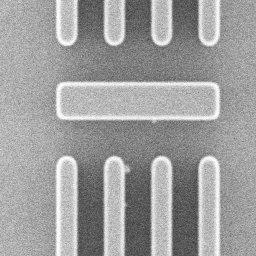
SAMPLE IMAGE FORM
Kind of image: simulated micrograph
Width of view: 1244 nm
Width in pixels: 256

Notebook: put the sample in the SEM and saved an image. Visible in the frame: groups of lines, slits or small figures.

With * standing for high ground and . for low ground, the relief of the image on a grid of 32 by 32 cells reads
.......***...**....**....**.....
.......***...**....**....**.....
.......***...**....**....**.....
.......***...**....**....**.....
.......***...**....**....**.....
........*.....*.....*.....*.....
................................
................................
................................
................................
........*******************.....
.......********************.....
.......********************.....
.......********************.....
.......********************.....
................................
................................
................................
................................
................................
.......**....**....**....**.....
.......***...**....**....**.....
.......***...**....**....**.....
.......***...**....**....**.....
.......***...**....**....**.....
.......***...**....**....**.....
.......***...**....**....**.....
.......***...**....**....**.....
.......***...**....**....**.....
.......***...**....**....**.....
.......***...**....**....**.....
.......***...**....**....**.....